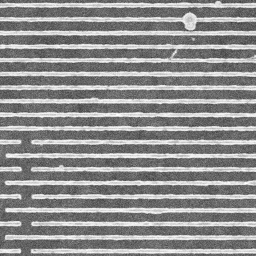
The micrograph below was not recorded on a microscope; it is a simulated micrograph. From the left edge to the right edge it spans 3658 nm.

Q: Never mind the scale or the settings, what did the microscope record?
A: parallel lines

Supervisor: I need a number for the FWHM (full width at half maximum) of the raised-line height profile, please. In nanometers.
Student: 37.5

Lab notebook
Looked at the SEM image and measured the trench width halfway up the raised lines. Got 148 nanometres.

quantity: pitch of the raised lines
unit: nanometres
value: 195